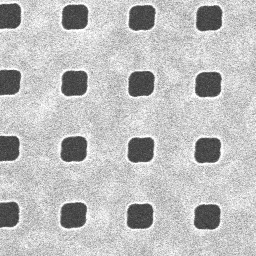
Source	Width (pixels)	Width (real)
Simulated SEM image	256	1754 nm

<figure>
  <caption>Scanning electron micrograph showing a regular array of holes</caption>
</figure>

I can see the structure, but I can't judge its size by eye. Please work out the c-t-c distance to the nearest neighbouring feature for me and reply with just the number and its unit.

452 nanometres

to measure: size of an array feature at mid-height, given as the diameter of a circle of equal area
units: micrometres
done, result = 0.19